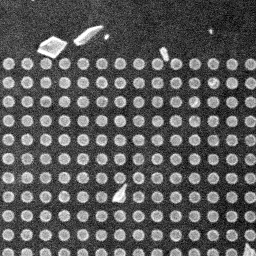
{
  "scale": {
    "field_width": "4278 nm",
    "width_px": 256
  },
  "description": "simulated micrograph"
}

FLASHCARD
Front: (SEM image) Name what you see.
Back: a regular array of raised bodies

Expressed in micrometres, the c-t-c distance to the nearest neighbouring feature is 0.309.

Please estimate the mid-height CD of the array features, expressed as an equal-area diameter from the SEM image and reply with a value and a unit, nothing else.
176 nm